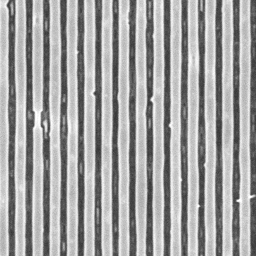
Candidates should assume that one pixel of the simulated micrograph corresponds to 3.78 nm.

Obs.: parallel lines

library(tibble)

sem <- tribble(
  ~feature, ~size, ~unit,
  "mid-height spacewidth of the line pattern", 29.8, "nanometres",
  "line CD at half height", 37.3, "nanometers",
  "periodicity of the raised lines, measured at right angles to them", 65.2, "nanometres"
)